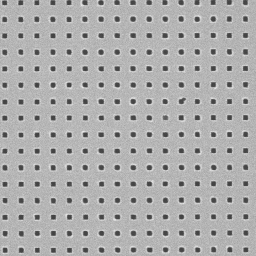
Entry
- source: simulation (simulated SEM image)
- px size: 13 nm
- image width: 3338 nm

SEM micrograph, a regular array of holes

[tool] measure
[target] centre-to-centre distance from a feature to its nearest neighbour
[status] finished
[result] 0.209 micrometres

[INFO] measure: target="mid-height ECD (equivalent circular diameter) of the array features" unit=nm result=73.6